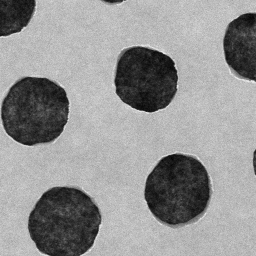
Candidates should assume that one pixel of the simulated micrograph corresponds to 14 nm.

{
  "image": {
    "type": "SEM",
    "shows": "holes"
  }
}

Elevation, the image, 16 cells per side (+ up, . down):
..++++++++++++++
..++++++++++++..
++++++++++++++..
+++++++...++++..
+++++++....++++.
+...+++....+++++
....++++...+++++
....++++++++++++
+...++++++++++++
++++++++++++++++
++++++++++...+++
+++++++++....+++
++....+++....+++
++....++++...+++
++....++++++++++
++....++++++++++